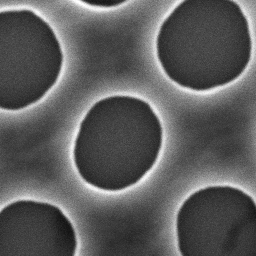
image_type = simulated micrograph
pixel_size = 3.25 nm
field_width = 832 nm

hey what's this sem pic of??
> holes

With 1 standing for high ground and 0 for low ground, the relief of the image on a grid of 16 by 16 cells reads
1111111111100001
0001111111000000
0000111111000000
0000111111000000
0000111111000001
0001111111110011
0011110001111111
1111100000111111
1111100000111111
1111100000111111
1111100001111111
1111110011111111
1111111111110000
0000111111100000
0000011111100000
0000011111100000